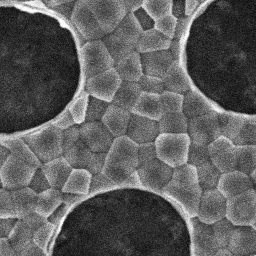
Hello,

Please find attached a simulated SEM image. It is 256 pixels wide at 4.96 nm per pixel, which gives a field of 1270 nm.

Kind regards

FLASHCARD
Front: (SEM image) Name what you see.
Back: holes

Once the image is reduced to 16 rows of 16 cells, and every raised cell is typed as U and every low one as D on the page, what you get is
DUUUUUUUUUUUUDDD
DDDDUUUUUUUUDDDD
DDDDDUUUUUUUDDDD
DDDDDUUUUUUDDDDD
DDDDDUUUUUUUDDDD
DDDDDUUUUUUUDDDD
DDDDUUUUUUUUUDDD
DDDUUUUUUUUUUUUU
UUUUUUUUUUUUUUUU
UUUUUUUUUUUUUUUU
UUUUUUUUUUUUUUUU
UUUUUUUUUUUUUUUU
UUUUUDDDDDUUUUUU
UUUUDDDDDDDUUUUU
UUUUDDDDDDDDUUUU
UUUDDDDDDDDDUUUU